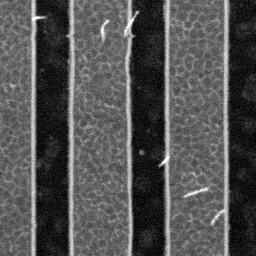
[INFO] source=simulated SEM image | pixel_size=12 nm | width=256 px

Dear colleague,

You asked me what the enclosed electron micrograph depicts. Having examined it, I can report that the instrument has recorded one or a few lines or trenches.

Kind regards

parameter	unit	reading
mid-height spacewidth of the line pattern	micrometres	0.467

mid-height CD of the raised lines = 0.7 µm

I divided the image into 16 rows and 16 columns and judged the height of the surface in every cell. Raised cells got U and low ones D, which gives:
UUDDDUUUDDDUUUDD
UUDDDUUUDDDUUUDD
UUDDDUUUDDDUUUDD
UUDDDUUUDDDUUUDD
UUDDDUUUDDUUUUDD
UUDDDUUUDDUUUUDD
UUDDUUUUDDUUUUDD
UUDDUUUUDDUUUUDD
UUDDDUUUDDDUUUDD
UUDDDUUUDDUUUUDD
UUDDDUUUDDUUUUDD
UUDDDUUUDDDUUUDD
UUDDDUUUDDDUUUDD
UUDDUUUUDDDUUUDD
UUDDDUUUDDDUUUDD
UUDDDUUUDDDUUUDD